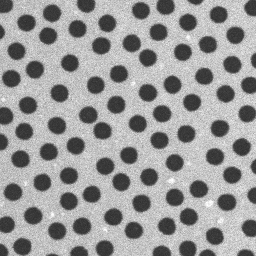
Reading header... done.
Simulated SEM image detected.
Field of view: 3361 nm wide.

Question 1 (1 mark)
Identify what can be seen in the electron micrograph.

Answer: a regular array of holes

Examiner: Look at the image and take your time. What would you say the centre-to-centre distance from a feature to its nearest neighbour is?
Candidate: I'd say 344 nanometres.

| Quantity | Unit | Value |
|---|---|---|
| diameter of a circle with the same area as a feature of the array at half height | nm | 238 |